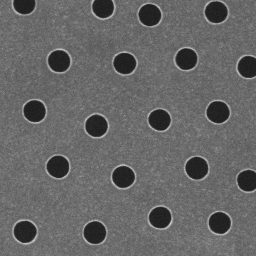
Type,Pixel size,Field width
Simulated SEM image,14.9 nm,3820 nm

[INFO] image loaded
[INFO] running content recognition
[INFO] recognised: a regular array of holes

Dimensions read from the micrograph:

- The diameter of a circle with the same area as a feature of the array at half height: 22.6 px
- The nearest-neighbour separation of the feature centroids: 836 nm